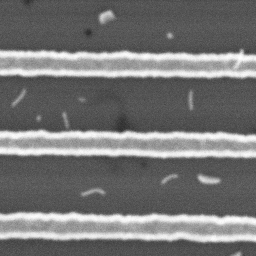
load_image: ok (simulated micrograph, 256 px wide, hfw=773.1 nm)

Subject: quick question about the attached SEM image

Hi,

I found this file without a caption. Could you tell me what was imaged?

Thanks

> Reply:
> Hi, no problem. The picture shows lines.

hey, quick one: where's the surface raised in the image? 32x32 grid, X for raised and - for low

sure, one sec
--------------------------------
--------------------------------
--------------------------------
--------------------------------
--------------------------------
--------------------------------
--------------------------------
XXXXXXXXXXXXXXXXXXXXXXXXXXXXXXXX
XXXXXXXXXXXXXXXXXXXXXXXXXXXXXXXX
--------------------------X--XX-
--------------------------------
--------------------------------
--------------------------------
--------------------------------
--------------------------------
--------------------------------
-----X--------------------------
XXXXXXXXXXXXXXXXXXXXXXXXXXXXXXXX
XXXXXXXXXXXXXXXXXXXXXXXXXXXXXXXX
--------------------X---------X-
--------------------------------
--------------------------------
--------------------------------
--------------------------------
--------------------------------
--------------------------------
--------------------------------
XXXXXXXXXXXXXXXXXXXXXXXXXXXXXXXX
XXXXXXXXXXXXXXXXXXXXXXXXXXXXXXXX
XXXXXXXXXXXXXXXXXXXXXXXXXXXXXXXX
--------------------------------
--------------------------------